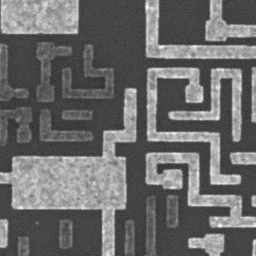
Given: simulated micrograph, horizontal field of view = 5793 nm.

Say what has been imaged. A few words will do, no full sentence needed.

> wiring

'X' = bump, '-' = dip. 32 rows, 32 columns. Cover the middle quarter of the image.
-----XX-------------------------
XX---XXXXXXX---------XXXXXXXXXXX
XX---XXXXXXX---------XXXXXXXXXXX
XX--------XX---------XX--------X
XX--------XX---------XX---------
XX--------XX---------XX--------X
XX--------XX---XXX---XX--------X
XXXXXXXXXXXX---XXX---XX--------X
---------------XXX---XX--------X
---------------XXX---XX--------X
---------------XXX---XX---------
---------------XXX---XX---------
XXXXXXX--------XXX---XX---XXXXXX
XXXXXXX--------XXX---XX----XXXXX
---------------XXX---XX---------
---------------XXX---XX---------
---------------XXX---XX---------
XXXXXXX---XXXXXXXX---XXXXXXXXXXX
XXXXXXX---XXXXXXXX---XXXXXXXXXXX
----------XXX-------------------
----------XX--------------------
----------XX--------------------
----------XX---------XXXXXXXXXXX
XXXXXXXXXXXXX--------XXXXXXXXXXX
XXXXXXXXXXXXXXX------XXXXXXXXXXX
XXXXXXXXXXXXXXX------XX--------X
XXXXXXXXXXXXXXX------XX--------X
XXXXXXXXXXXXXXX------XX--XXXX--X
XXXXXXXXXXXXXXX------XXXXXXXX--X
XXXXXXXXXXXXXXX------XXXXXXXX--X
XXXXXXXXXXXXXXX----------XXXX--X
XXXXXXXXXXXXXXX----------------X